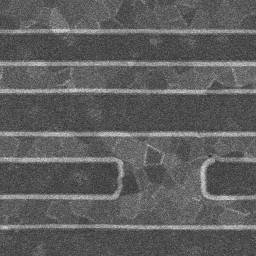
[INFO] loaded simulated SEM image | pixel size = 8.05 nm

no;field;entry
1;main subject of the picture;one or a few lines or trenches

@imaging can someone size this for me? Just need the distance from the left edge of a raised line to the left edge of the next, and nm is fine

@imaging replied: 541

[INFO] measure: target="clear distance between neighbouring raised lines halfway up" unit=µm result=0.301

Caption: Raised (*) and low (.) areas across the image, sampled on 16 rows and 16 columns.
****************
****************
................
................
****************
****************
................
................
****************
****************
........*****...
.......******...
****************
****************
................
................